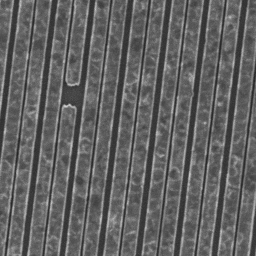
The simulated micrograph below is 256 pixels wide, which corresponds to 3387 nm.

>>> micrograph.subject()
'parallel lines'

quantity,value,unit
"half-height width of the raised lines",0.182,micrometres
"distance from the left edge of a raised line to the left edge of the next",18.9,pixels